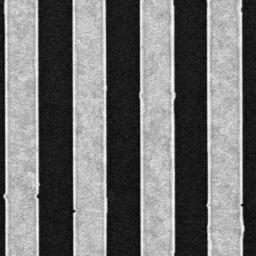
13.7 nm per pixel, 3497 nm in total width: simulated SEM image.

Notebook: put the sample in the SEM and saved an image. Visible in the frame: one or a few lines or trenches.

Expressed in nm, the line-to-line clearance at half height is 494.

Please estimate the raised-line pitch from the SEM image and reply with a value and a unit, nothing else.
926 nm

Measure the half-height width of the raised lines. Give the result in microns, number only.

0.429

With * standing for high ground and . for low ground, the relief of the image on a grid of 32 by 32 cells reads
.****....****.....***.....****..
.****....****.....***.....****..
.****....****.....***.....****..
.****....****.....***.....****..
.****....****.....***.....****..
.****....****.....***.....****..
.****....****.....***.....****..
.****....****.....***.....****..
.****....****.....****....****..
.****....****.....****....****..
.****....****.....****....****..
.****....****.....****....****..
.****....****.....****....****..
.****....****.....****....****..
.****....****.....****....****..
.****....****.....****....****..
.****....****.....****....****..
.****....****.....****....****..
.****....****.....****....****..
.****....****.....****....****..
.****....****.....****....****..
.****....****.....****....****..
.****....****.....****....****..
.****....****.....****....****..
.****....****.....****....****..
.****....****.....****....****..
.****....****.....****....****..
.****....****.....****....****..
.****....****.....****....****..
.****....****.....****....****..
.****....****.....****....****..
.****....****.....****....****..